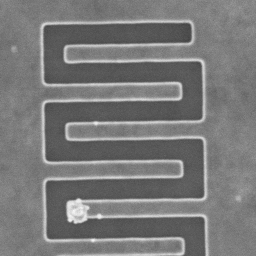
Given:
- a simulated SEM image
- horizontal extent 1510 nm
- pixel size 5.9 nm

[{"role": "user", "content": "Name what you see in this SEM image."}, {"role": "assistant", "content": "groups of lines, slits or small figures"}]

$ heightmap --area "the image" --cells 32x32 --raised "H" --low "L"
HHHHHHHHHHHHHHHHHHHHHHHHHHHHHHHH
HHHHHHHHHHHHHHHHHHHHHHHHHHHHHHHH
HHHHHHHHHHHHHHHHHHHHHHHHHHHHHHHH
HHHHHLLLLLLLLLLLLLLLLLLLHHHHHHHH
HHHHHLLLLLLLLLLLLLLLLLLLHHHHHHHH
HHHHHLLLLLLLLLLLLLLLHHHHHHHHHHHH
HHHHHLLLHHHHHHHHHHHHHHHHHHHHHHHH
HHHHHLLLHHHHHHHHHHHHHHHHHHHHHHHH
HHHHHLLLLLLLLLLLLLLLLLLLLHHHHHHH
HHHHHLLLLLLLLLLLLLLLLLLLLHHHHHHH
HHHHHHLLLLLLLLLHHHHHHHLLLHHHHHHH
HHHHHHHHHHHHHHHHHHHHHHHLLLHHHHHH
HHHHHHHHHHHHHHLLLLLLLLLLLLHHHHHH
HHHHHLLLLLLLLLLLLLLLLLLLLLHHHHHH
HHHHHLLLLLLLLLLLLLLLLLLLLHHHHHHH
HHHHHLLLLHHHHHHHHHHHHHHHHHHHHHHH
HHHHHLLLHHHHHHHHHHHHHHHHHHHHHHHH
HHHHHLLLLHHLLLLLLLLLLLLLLHHHHHHH
HHHHHHLLLLLLLLLLLLLLLLLLLLHHHHHH
HHHHHHLLLLLLLLLLLLLLLLLLLLHHHHHH
HHHHHHHHHHHHHHHHHHHHHHHLLLHHHHHH
HHHHHHHHHHHHHHHHHHHHHHHLLLHHHHHH
HHHHHHLLLLLLLLLLLLLLLLLLLLHHHHHH
HHHHHHLLLLLLLLLLLLLLLLLLLLHHHHHH
HHHHHHLLLLLLLLLLLLLLLLLLLHHHHHHH
HHHHHHLLLHHHHHHHHHHHHHHHHHHHHHHH
HHHHHHLLHHHHHHHHHHHHHHHHHHHHHHHH
HHHHHHLLLHHLLLLLLLLLLLLLLLHHHHHH
HHHHHHLLLLLLLLLLLLLLLLLLLLHHHHHH
HHHHHHLLLLLLLLLLLLLLLLLLLLHHHHHH
HHHHHHHHHHHHHHHHHHHHHHHLLLHHHHHH
HHHHHHHHHHHHHHHHHHHHHHHLLLHHHHHH